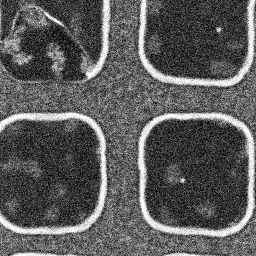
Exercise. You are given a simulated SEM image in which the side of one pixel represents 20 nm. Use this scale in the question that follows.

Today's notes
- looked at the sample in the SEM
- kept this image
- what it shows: raised bodies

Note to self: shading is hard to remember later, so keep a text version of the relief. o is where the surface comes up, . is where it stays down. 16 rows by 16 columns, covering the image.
ooooooo..ooooooo
o...ooo..ooooooo
.....oo..ooooooo
.....o...ooooooo
..........ooooo.
................
................
.oooo.....oooo..
oooooo...ooooooo
oooooo...ooooooo
oooooo...ooooooo
oooooo...ooooooo
oooooo...ooooooo
oooooo...oooooo.
.............o..
................